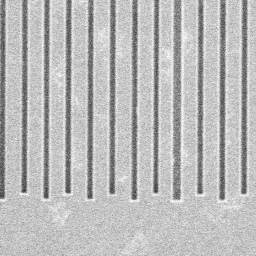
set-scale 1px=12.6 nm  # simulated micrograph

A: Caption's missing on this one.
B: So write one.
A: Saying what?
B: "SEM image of parallel lines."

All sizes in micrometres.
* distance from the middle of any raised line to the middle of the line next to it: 0.277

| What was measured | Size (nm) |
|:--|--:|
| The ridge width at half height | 194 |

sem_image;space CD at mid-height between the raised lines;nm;86.6